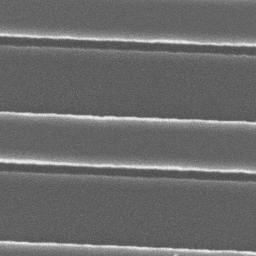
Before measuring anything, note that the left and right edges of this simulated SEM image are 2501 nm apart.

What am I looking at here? lines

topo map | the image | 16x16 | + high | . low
++++++++++++++++
++++++++++++++++
.......+++++++++
................
................
................
................
+++++++++++.....
++++++++++++++++
++++++++++++++++
.........+++++++
................
................
................
................
+++++++++.......